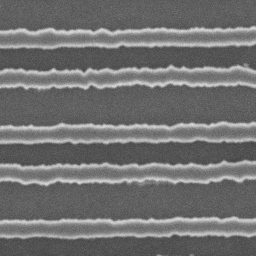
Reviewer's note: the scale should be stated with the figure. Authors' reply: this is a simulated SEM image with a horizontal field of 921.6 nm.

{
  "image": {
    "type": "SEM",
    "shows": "lines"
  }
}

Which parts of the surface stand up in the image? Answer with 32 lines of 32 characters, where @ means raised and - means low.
--------------------------------
--------------------------------
--------------------------------
------------------------------@@
@@@@@@@@@@@@@@@@@@@@@@@@@@@@@@@@
@@@@@@@@@@@@@@@@@@@@@@@@@@@@@@@@
--------------------------------
--------------------------------
---------------------@----@--@--
@@@@@@@@@@@@@@@@@@@@@@@@@@@@@@@@
@@@@@@@@@@@@@@@@@-@@@-@@@@@@@@@@
--------------------------------
--------------------------------
--------------------------------
--------------------------------
---------------------------@@@@@
@@@@@@@@@@@@@@@@@@@@@@@@@@@@@@@@
@@@@@@@@@@@@@@@@@@@@@@@@@@@@@@@@
--------------------------------
--------------------------------
-------------@----@@-------@@@@@
@@@@@@@@@@@@@@@@@@@@@@@@@@@@@@@@
@@@@@@@@@@@@@@@@@@--@@@@@@@@-@--
--------------------------------
--------------------------------
--------------------------------
--------------------------------
--------@---@@--@@---@@@@@@@@@@@
@@@@@@@@@@@@@@@@@@@@@@@@@@@@@@@@
@@@@@@@@@@@@@@@@@@@@@---@---@-@@
--------------------------------
--------------------------------